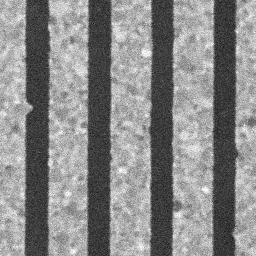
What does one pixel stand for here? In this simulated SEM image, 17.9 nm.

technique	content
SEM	one or a few lines or trenches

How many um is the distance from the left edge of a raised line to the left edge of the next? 1.12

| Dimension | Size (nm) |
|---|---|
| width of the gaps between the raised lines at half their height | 428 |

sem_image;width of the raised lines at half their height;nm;691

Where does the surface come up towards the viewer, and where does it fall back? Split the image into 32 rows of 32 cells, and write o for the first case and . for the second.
ooo...ooooo...ooooo...ooooo...oo
ooo...ooooo...ooooo...ooooo...oo
ooo...ooooo...ooooo...ooooo...oo
ooo...ooooo...ooooo...ooooo...oo
ooo...ooooo...ooooo...ooooo...oo
ooo...ooooo...ooooo...ooooo...oo
ooo...ooooo...ooooo...ooooo...oo
ooo...ooooo...ooooo...ooooo...oo
ooo...ooooo...ooooo...ooooo...oo
ooo...ooooo...ooooo...ooooo...oo
ooo...ooooo...ooooo...ooooo...oo
ooo...ooooo...ooooo...ooooo...oo
ooo...ooooo...ooooo...ooooo...oo
oooo..ooooo...ooooo...ooooo...oo
ooo...ooooo...ooooo...ooooo...oo
ooo...ooooo...ooooo...ooooo...oo
ooo...ooooo...ooooo...oooo....oo
ooo...ooooo...ooooo...ooooo...oo
ooo...ooooo...ooooo...ooooo...oo
ooo...ooooo...ooooo...ooooo...oo
ooo...ooooo...ooooo...ooooo...oo
ooo...ooooo...ooooo...ooooo...oo
ooo...ooooo...ooooo...ooooo...oo
ooo...ooooo...ooooo...oooo....oo
ooo...ooooo...ooooo...ooooo...oo
ooo...ooooo...ooooo...ooooo...oo
ooo...ooooo...ooooo...ooooo...oo
ooo...ooooo...ooooo...oooo...ooo
ooo...ooooo...ooooo...oooo...ooo
ooo...ooooo...ooooo...ooooo..ooo
ooo...ooooo...ooooo...oooo....oo
ooo...ooooo...ooooo...oooo...ooo